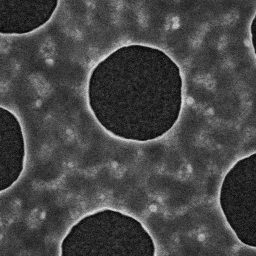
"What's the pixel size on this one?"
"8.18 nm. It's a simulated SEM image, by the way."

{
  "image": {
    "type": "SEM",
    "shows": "holes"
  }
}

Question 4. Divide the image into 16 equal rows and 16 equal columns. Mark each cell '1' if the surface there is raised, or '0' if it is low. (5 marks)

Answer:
0001111111111111
0001111111111111
1111111111111111
1111111000111111
1111110000011111
1111110000011111
1111110000011111
0111110000011111
0111111000111111
0011111111111111
0111111111111100
0111111111111100
1111111111111100
1111100011111100
1111000001111110
1111000000111111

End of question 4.